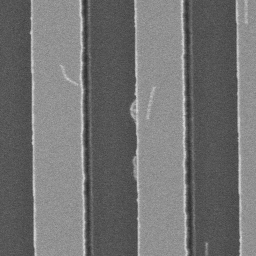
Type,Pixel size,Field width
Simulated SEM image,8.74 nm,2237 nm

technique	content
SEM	lines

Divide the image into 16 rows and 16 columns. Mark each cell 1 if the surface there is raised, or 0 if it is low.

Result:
0011100011100001
0011100011100001
0011100011100001
0011100011100001
0011100011100001
0011100011110001
0011100001110001
0011100001110001
0011100001110001
0011100001110001
0011100001110001
0011100001110001
0011100001110001
0011100001110001
0011100001110001
0011100001110001